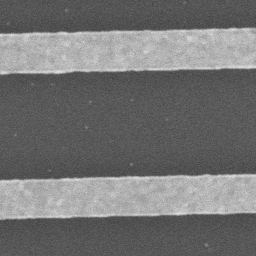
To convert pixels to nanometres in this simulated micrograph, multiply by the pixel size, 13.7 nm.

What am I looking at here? lines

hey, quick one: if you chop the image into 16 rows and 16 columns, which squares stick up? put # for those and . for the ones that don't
................
................
################
################
####............
................
................
................
................
................
................
################
################
#######.........
................
................